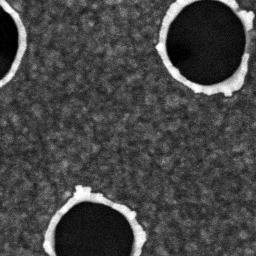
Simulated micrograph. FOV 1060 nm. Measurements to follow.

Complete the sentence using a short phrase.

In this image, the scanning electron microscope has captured holes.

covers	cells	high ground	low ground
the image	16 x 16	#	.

############..##
.##########....#
.#########.....#
.#########.....#
.##########....#
################
################
################
################
################
################
################
################
####....########
###.....########
###.....########